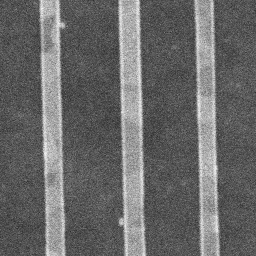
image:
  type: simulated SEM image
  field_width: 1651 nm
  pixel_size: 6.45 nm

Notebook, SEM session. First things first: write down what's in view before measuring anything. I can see one or a few lines or trenches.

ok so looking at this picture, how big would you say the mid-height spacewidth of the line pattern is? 388 nanometers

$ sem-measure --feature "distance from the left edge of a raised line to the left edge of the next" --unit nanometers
498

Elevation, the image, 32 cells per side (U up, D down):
DDDDDUUDDDDDDDDUUDDDDDDDDUDDDDDD
DDDDDUUDDDDDDDDUUDDDDDDDDUUDDDDD
DDDDDUUDDDDDDDDUUDDDDDDDDUUDDDDD
DDDDDUUDDDDDDDDUUDDDDDDDDUUDDDDD
DDDDDUUDDDDDDDDUUDDDDDDDDUUDDDDD
DDDDDUUDDDDDDDDUUDDDDDDDDUUDDDDD
DDDDDUUDDDDDDDDUUDDDDDDDDUUDDDDD
DDDDDUUDDDDDDDDUUDDDDDDDDUUDDDDD
DDDDDUUDDDDDDDDUUDDDDDDDDUUDDDDD
DDDDDUUDDDDDDDDUUDDDDDDDDUUDDDDD
DDDDDUUDDDDDDDDUUDDDDDDDDUUDDDDD
DDDDDUUDDDDDDDDUUUDDDDDDDUUDDDDD
DDDDDUUDDDDDDDDUUUDDDDDDDUUDDDDD
DDDDDUUDDDDDDDDUUUDDDDDDDUUDDDDD
DDDDDUUDDDDDDDDUUUDDDDDDDUUDDDDD
DDDDDDUUDDDDDDDUUUDDDDDDDUUDDDDD
DDDDDDUUDDDDDDDUUUDDDDDDDUUDDDDD
DDDDDDUUDDDDDDDUUUDDDDDDDUUDDDDD
DDDDDDUUDDDDDDDUUUDDDDDDDUUDDDDD
DDDDDDUUDDDDDDDUUUDDDDDDDUUDDDDD
DDDDDDUUDDDDDDDUUUDDDDDDDUUDDDDD
DDDDDDUUDDDDDDDDUUDDDDDDDUUDDDDD
DDDDDDUUDDDDDDDDUUDDDDDDDUUDDDDD
DDDDDDUUDDDDDDDDUUDDDDDDDUUDDDDD
DDDDDDUUDDDDDDDDUUDDDDDDDUUDDDDD
DDDDDDUUDDDDDDDDUUDDDDDDDUUDDDDD
DDDDDDUUDDDDDDDDUUDDDDDDDUUDDDDD
DDDDDDUUDDDDDDDDUUDDDDDDDUUDDDDD
DDDDDDUUDDDDDDDDUUDDDDDDDUUDDDDD
DDDDDDUUDDDDDDDDUUDDDDDDDUUDDDDD
DDDDDDUUDDDDDDDDUUDDDDDDDUUDDDDD
DDDDDDUUDDDDDDDDUUDDDDDDDUUDDDDD